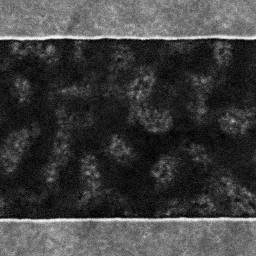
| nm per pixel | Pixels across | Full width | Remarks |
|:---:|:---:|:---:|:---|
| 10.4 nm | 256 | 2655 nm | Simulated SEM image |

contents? one or a few lines or trenches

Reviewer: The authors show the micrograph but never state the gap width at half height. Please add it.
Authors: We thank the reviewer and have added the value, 1880 nanometers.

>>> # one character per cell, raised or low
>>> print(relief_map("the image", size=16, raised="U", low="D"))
UUUUUUUUUUUUUUUU
UUUUUUUUUUUUUUUU
DDDDDDDDDDDDDDDD
DDDDDDDDDDDDDDDD
DDDDDDDDDDDDDDDD
DDDDDDDDDDDDDDDD
DDDDDDDDDDDDDDDD
DDDDDDDDDDDDDDDD
DDDDDDDDDDDDDDDD
DDDDDDDDDDDDDDDD
DDDDDDDDDDDDDDDD
DDDDDDDDDDDDDDDD
DDDDDDDDDDDDDDDD
DDDDDDDDDDDDDDDD
UUUUUUUUUUUUUUUU
UUUUUUUUUUUUUUUU